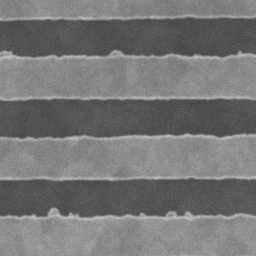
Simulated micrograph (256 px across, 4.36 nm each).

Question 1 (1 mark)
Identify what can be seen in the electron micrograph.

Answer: lines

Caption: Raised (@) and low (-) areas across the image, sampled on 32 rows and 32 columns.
@@@@@@@@@@@@@@@@@@@@@@@@@@@@@@@@
@@@@@@@@@@@@@@@@@@@@@@@@@@@@@@@@
@@------------------------------
--------------------------------
--------------------------------
--------------------------------
--------------------------------
@@@@@@@@@@@@@@@@@@@@@@@@@@@@@@@@
@@@@@@@@@@@@@@@@@@@@@@@@@@@@@@@@
@@@@@@@@@@@@@@@@@@@@@@@@@@@@@@@@
@@@@@@@@@@@@@@@@@@@@@@@@@@@@@@@@
@@@@@@@@@@@@@@@@@@@@@@@@@@@@@@@@
@@@-----------------------------
--------------------------------
--------------------------------
--------------------------------
--------------------------------
@@@@@@@@@@@@@@@@@@@@@@@@@@@@@@@@
@@@@@@@@@@@@@@@@@@@@@@@@@@@@@@@@
@@@@@@@@@@@@@@@@@@@@@@@@@@@@@@@@
@@@@@@@@@@@@@@@@@@@@@@@@@@@@@@@@
@@@@@@@@@@@@@@@@@@@@@@@@@@@@@@@@
-------@-----@------------------
--------------------------------
--------------------------------
--------------------------------
--------------------------------
@@@@@@@@@@@@@@@@@@@@@@@@@@@@@@@@
@@@@@@@@@@@@@@@@@@@@@@@@@@@@@@@@
@@@@@@@@@@@@@@@@@@@@@@@@@@@@@@@@
@@@@@@@@@@@@@@@@@@@@@@@@@@@@@@@@
@@@@@@@@@@@@@@@@@@@@@@@@@@@@@@@@